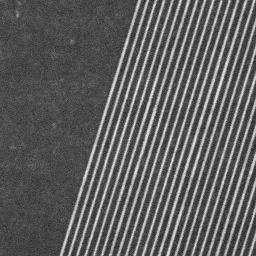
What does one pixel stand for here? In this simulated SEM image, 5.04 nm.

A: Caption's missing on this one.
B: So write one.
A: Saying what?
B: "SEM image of parallel lines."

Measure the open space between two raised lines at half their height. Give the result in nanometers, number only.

28.3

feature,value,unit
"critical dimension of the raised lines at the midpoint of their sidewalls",8.4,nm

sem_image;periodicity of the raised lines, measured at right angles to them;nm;39.4